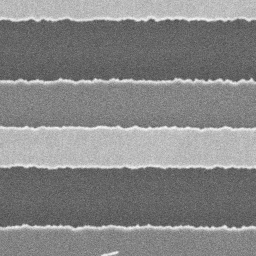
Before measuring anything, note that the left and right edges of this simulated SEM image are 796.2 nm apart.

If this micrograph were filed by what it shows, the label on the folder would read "lines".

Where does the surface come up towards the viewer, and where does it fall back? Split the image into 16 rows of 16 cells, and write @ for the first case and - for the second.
@@@@@@@@@@@@@@@@
----------------
----------------
----------------
----------------
@@@@@@@@@@@@@@@@
@@@@@@@@@@@@@@@@
@@@@@@@@@@@@@@@@
@@@@@@@@@@@@@@@@
@@@@@@@@@@@@@@@@
---@------------
----------------
----------------
----------------
@@@@@@@@@@@@@@@@
@@@@@@@@@@@@@@@@